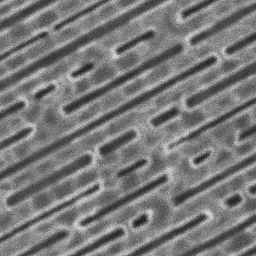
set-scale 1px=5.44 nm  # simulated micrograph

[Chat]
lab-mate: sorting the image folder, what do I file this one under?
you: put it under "parallel lines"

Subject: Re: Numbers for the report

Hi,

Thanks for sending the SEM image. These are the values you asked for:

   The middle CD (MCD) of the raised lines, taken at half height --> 97.2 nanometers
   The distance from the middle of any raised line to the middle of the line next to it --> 0.144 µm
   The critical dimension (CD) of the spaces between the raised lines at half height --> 43.5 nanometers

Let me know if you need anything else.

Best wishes